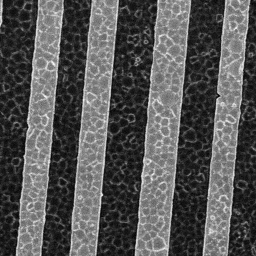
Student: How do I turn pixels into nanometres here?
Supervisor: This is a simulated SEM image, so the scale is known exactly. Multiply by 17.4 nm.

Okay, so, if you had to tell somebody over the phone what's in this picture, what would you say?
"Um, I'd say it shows one or a few lines or trenches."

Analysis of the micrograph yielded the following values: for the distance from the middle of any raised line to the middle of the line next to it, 1080 nm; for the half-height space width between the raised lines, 611 nm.